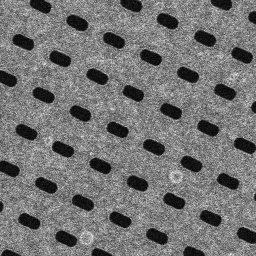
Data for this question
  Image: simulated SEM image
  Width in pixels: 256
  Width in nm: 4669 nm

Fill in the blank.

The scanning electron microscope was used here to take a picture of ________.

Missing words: a regular array of holes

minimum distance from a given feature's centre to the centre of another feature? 726 nanometres